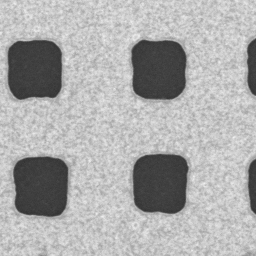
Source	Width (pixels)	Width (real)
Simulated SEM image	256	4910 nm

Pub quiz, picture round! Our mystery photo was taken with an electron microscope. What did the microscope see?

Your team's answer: holes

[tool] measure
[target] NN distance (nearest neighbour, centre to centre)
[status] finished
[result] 2.21 micrometres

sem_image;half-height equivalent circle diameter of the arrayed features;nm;1180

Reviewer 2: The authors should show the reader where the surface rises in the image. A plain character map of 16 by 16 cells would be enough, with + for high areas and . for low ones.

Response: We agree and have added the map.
++++++++++++++++
++++++++++++++++
++++++++++++++++
....++++....+++.
....++++....+++.
+...++++....++++
++++++++++++++++
++++++++++++++++
++++++++++++++++
++++++++++++++++
+...++++....++++
+...++++....++++
+...++++....++++
++++++++++++++++
++++++++++++++++
++++++++++++++++